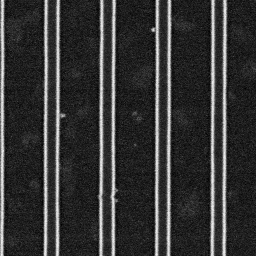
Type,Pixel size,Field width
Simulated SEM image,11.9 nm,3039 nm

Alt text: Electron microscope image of parallel lines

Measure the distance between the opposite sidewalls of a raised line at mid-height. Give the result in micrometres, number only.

0.141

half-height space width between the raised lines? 515 nm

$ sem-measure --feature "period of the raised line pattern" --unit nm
660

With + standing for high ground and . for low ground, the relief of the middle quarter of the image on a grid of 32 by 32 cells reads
.........+++...........+++......
.........+++...........+++......
.........+++...........+++......
.........+++...........+++......
.........+++...........+++......
.........+++...........+++......
.........+++...........+++......
.........+++...........+++......
.........+++...........+++......
.........+++...........+++......
.........+++...........+++......
.........+++...........+++......
.........+++...........+++......
.........+++...........+++......
.........+++...........+++......
.........+++...........+++......
.........+++...........+++......
.........+++...........+++......
.........+++...........+++......
..........++...........+++......
..........++...........+++......
..........++...........+++......
..........++...........+++......
.........+++...........+++......
.........+++...........+++......
.........+++...........+++......
.........+++...........+++......
.........+++...........+++......
.........+++...........+++......
.........+++...........+++......
.........+++...........+++......
.........+++...........+++......